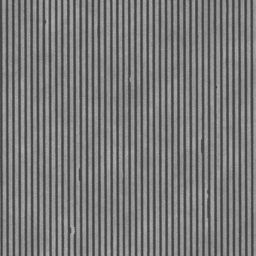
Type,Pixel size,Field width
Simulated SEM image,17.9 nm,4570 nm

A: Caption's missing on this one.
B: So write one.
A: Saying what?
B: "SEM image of parallel lines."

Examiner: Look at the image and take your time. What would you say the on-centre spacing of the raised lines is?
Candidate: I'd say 0.109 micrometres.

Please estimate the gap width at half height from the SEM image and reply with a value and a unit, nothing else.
0.0491 um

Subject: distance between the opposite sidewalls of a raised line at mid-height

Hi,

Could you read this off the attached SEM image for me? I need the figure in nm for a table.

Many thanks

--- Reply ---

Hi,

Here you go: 66.9